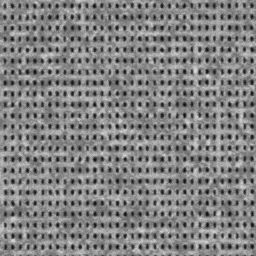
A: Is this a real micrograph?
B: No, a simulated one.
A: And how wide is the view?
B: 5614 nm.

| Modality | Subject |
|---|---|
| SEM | a regular array of holes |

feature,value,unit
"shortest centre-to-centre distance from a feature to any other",162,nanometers